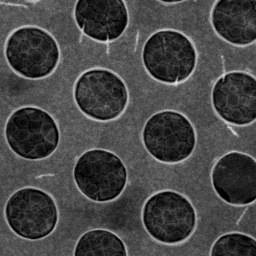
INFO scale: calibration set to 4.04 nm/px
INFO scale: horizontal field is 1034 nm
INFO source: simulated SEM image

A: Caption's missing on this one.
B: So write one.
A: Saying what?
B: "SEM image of a regular array of holes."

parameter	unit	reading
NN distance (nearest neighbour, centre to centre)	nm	318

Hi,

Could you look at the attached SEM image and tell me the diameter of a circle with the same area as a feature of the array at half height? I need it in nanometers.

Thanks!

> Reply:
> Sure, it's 210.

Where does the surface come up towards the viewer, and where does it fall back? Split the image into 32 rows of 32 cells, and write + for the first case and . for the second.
++++++++++......+++++++++++.....
+++++++++.......+++++++++++.....
+++++++++.......++++++++++......
+++..+++++......+++++++++++.....
+.....+++++....++++....+++++....
+......+++++++++++......+++++..+
+......+++++++++++......++++++++
+......+++++++++++......++++++++
++.....+++++++++++......++++++++
+++...++++.....++++....+++++...+
+++++++++......++++++++++++.....
+++++++++.......+++++++++++.....
+++++++++.......+++++++++++.....
+++.++++++......+++++++++++.....
+.....+++++....++++....+++++....
+......+++++++++++......++++++.+
+......+++++++++++......++++++++
+......+++++++++++......++++++++
+......+++++++++++......++++++++
+++...++++....+++++.....++++...+
++++++++++.....++++++++++++.....
+++++++++.......+++++++++++.....
+++++++++.......+++++++++++.....
+++.++++++.....++++++++++++.....
+.....+++++....++++....++++.....
+......+++++++++++......+++++..+
+......+++++++++++......++++++++
+......+++++++++++......++++++++
+......+++++++++++......++++++++
+++...++++.....++++.....++++...+
++++++++++.....++++++++++++.....
+++++++++.......++++++++++......